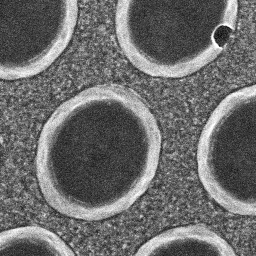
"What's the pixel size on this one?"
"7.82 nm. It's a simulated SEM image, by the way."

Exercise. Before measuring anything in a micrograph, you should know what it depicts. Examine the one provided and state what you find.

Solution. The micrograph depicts raised bodies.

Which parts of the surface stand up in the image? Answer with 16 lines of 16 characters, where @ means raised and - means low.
@@@@----@@@@@@--
@@@@----@@@@@@--
@@@@----@@@@@---
@@@-----@@@@@---
@@--------------
----------------
-----@@@------@@
----@@@@@----@@@
---@@@@@@@---@@@
---@@@@@@@---@@@
---@@@@@@----@@@
---@@@@@@----@@@
----@@@@------@@
----------------
----------------
@@@@-----@@@@@--